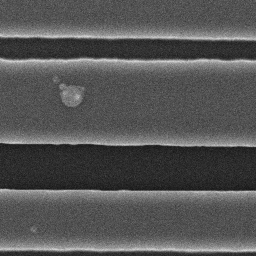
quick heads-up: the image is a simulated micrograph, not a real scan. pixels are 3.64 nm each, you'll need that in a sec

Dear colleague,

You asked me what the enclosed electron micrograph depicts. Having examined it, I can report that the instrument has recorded lines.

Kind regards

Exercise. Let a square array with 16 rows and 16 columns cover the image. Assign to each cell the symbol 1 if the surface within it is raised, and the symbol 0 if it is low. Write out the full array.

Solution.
1111111111111111
1111111111111111
1111111111111111
1111111111111111
1111111111111111
1111111111111111
1111111111111111
1111111111111111
1111111111111111
0000000000000000
0000000000000000
0000000000000000
1111111111111111
1111111111111111
1111111111111111
1111111111111111